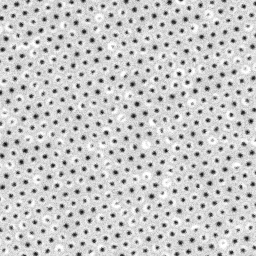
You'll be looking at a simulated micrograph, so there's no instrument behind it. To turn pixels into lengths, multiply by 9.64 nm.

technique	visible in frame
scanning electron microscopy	a regular array of holes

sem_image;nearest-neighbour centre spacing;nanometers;112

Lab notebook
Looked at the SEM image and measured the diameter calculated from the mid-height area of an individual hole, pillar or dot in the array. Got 52.2 nm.